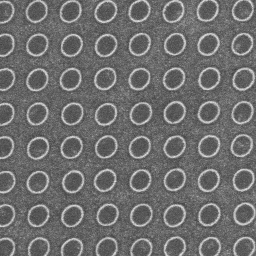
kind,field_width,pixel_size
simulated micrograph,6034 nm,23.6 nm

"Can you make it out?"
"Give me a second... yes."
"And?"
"a regular array of raised bodies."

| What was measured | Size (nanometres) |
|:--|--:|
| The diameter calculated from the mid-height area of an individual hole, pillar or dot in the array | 490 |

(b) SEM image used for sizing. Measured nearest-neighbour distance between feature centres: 791 nanometers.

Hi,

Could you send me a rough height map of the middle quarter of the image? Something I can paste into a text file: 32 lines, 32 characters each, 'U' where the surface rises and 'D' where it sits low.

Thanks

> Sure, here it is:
DDDDDDDDDDDDDDDDDDDDDDDDDDDDDDDD
DUUDDDDDDDUUDDDDDDUUDDDDDDUUUDDD
UUUUDDDDUUUUUDDDDUUUUDDDDUUUUUDD
UUUUDDDDUUUUUDDDUUUUUDDDDUUUUUDD
UUUUDDDDUUUUUDDDUUUUUDDDDUUUUUDD
UUUDDDDDUUUUDDDDDUUUDDDDDUUUUDDD
DDDDDDDDDDDDDDDDDDDDDDDDDDDDDDDD
DDDDDDDDDDDDDDDDDDDDDDDDDDDDDDDD
DDDDDDDDDDDDDDDDDDDDDDDDDDDDDDDD
DDDDDDDDDDDDDDDDDDDDDDDDDDDDDDDD
DUUUDDDDDUUUDDDDDDUUUDDDDDUUUUDD
UUUUDDDDUUUUUDDDDUUUUUDDDUUUUUDD
UUUUDDDDUUUUUDDDDUUUUUDDDUUUUUDD
UUUUDDDDUUUUUDDDDUUUUDDDDUUUUUDD
UUUDDDDDUUUUDDDDDUUUDDDDDDUUDDDD
DDDDDDDDDDDDDDDDDDDDDDDDDDDDDDDD
DDDDDDDDDDDDDDDDDDDDDDDDDDDDDDDD
DDDDDDDDDDDDDDDDDDDDDDDDDDDDDDDD
DUUDDDDDDDUUDDDDDDUUUDDDDDUUUDDD
UUUUDDDDDUUUUDDDDUUUUDDDDDUUUUDD
UUUUDDDDUUUUUDDDUUUUUDDDDUUUUUDD
UUUUDDDDUUUUUDDDUUUUUDDDDUUUUUDD
UUUUDDDDUUUUDDDDDUUUUDDDDDUUUDDD
DDDDDDDDDDDDDDDDDDDDDDDDDDDDDDDD
DDDDDDDDDDDDDDDDDDDDDDDDDDDDDDDD
DDDDDDDDDDDDDDDDDDDDDDDDDDDDDDDD
DDDDDDDDDDUDDDDDDDDDDDDDDDDUUDDD
DUUUDDDDDUUUUDDDDDUUUDDDDDUUUUDD
UUUUUDDDUUUUUDDDDUUUUUDDDUUUUUDD
UUUUUDDDUUUUUDDDDUUUUDDDDUUUUUDD
UUUUDDDDUUUUDDDDDUUUUDDDDDUUUUDD
UUUUDDDDDUUDDDDDDDUDDDDDDDDDDDDD